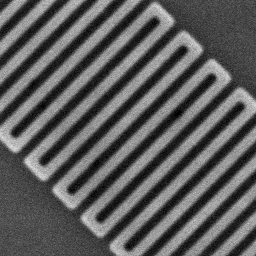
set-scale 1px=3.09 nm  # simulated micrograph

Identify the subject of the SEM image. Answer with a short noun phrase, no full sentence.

groups of lines, slits or small figures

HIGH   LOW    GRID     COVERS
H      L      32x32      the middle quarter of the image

HHHLLLHHHHLLLHHHHLLLLHHHLLLLHHHL
HHLLLHHHHLLLHHHHLLLLHHHLLLLHHHLL
HLLLHHHHLLLHHHHLLLLHHHLLLLHHHLLL
LLLLHHHLLLLHHHLLLLHHHLLLLHHHLLLL
LLLHHHLLLLHHHLLLLHHHLLLLHHHLLLLH
LLHHHLLLLHHHLLLLHHHLLLLHHHLLLLHH
LHHHLLLLHHHLLLLHHHLLLLHHHLLLLHHH
HHHLLLHHHHLLLLHHHLLLLHHHLLLLHHHL
HHLLLHHHHLLLLHHHLLLLHHHLLLLHHHLL
HLLLHHHHLLLLHHHLLLLHHHLLLLHHHLLL
LLLLHHHLLLLHHHLLLLHHHLLLLHHHLLLL
LLLHHHLLLLHHHLLLLHHHLLLLHHHLLLLH
LLHHHLLLLHHHLLLLHHHLLLLHHHLLLLHH
LHHHLLLLHHHLLLLHHHLLLLHHHLLLLHHH
HHHLLLLHHHLLLLHHHLLLLHHHLLLLHHHL
HHLLLLHHHLLLLHHHLLLLHHHLLLLHHHLL
HLLLLHHHLLLLHHHLLLLHHHLLLLHHHLLL
LLLLHHHLLLLHHHLLLLHHHLLLLHHHLLLL
LLLHHHLLLLHHHLLLLHHHLLLLHHHLLLLH
LLHHHLLLLHHHLLLLHHHLLLLHHHLLLLHH
LHHHLLLLHHHLLLLHHHLLLLHHHLLLLHHH
HHHLLLLHHHLLLLHHHLLLLHHHLLLLHHHL
HHLLLLHHHLLLLHHHLLLLHHHLLLLHHHLL
HLLLLHHHLLLLHHHLLLLHHHLLLLHHHLLL
LLLLHHHLLLLHHHLLLLHHHLLLLHHHLLLL
LLLHHHLLLLHHHLLLLHHHLLLLHHHLLLLH
LLHHHLLLLHHHLLLLHHHLLLLHHHLLLLHH
LHHHLLLLHHHLLLLHHHLLLLHHHLLLLHHH
HHHLLLLHHHLLLLHHHLLLLHHHLLLLHHHL
HHLLLLHHHLLLLHHHLLLLHHHLLLLHHHLL
HLLLLHHHLLLLHHHLLLLHHHLLLLHHHLLL
HLLLHHHLLLLHHHLLLLHHHLLLLHHHLLLL